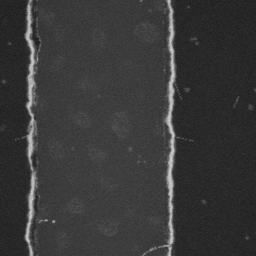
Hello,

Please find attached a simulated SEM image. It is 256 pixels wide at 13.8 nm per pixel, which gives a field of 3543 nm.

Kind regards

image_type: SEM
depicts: one or a few lines or trenches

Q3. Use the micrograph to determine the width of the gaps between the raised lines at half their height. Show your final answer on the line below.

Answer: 1940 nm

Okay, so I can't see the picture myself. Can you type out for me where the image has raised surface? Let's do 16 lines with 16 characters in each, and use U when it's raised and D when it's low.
UUDDDDDDDDDUUUUU
UUDDDDDDDDDUUUUU
UUDDDDDDDDDUUUUU
UUDDDDDDDDDUUUUU
UUDDDDDDDDDUUUUU
UUDDDDDDDDDUUUUU
UUDDDDDDDDDUUUUU
UUDDDDDDDDDUUUUU
UUDDDDDDDDDUUUUU
UUDDDDDDDDDUUUUU
UUDDDDDDDDDUUUUU
UUDDDDDDDDDUUUUU
UUDDDDDDDDDUUUUU
UUDDDDDDDDDUUUUU
UUDDDDDDDDDUUUUU
UUDDDDDDDDDUUUUU